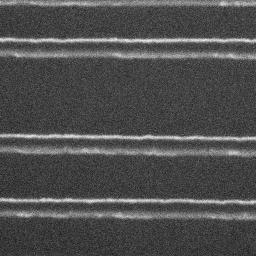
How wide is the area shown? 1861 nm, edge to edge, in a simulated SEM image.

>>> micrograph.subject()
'lines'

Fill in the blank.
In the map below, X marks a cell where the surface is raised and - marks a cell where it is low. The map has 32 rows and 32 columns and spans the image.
--------------------------------
--------------------------------
--------------------------------
--------------------------------
--------------------------------
XXXXXXXXXXXXXXXXXXXXXXXXXXXXXXXX
XXXXXXXXXXXXXXXXXXXXXXXXXXXXXXXX
--------------------------------
--------------------------------
--------------------------------
--------------------------------
--------------------------------
--------------------------------
--------------------------------
--------------------------------
--------------------------------
--------------------------------
XXXXXXXXXXXXXXXXXXXXXXXXXXXXXXXX
XXXXXXXXXXXXXXXXXXXXXXXXXXXXXXXX
--------------------------------
--------------------------------
--------------------------------
--------------------------------
--------------------------------
--------------------------------
XXXXXXXXXXXXXXXXXXXXXXXXXXXXXXXX
XXXXXXXXXXXXXXXXXXXXXXXXXXXXXXXX
--------------------------------
--------------------------------
--------------------------------
--------------------------------
--------------------------------